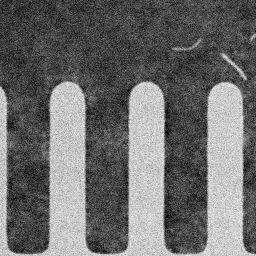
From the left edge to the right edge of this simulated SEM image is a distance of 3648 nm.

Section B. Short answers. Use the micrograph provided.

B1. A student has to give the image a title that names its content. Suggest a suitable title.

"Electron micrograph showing groups of lines, slits or small figures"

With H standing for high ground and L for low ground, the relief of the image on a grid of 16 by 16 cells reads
LLLLLLLLLLLLLLLL
LLLLLLLLLLLLLLLL
LLLLLLLLLLLLLLLL
LLLLLLLLLLLLLLLL
LLLLLLLLLLLLLLLL
LLLLHLLLLHLLLHHL
LLLHHLLLHHLLLHHL
LLLHHLLLHHLLLHHL
LLLHHLLLHHLLLHHL
LLLHHLLLHHLLLHHL
LLLHHLLLHHLLLHHL
LLLHHLLLHHLLLHHL
LLLHHLLLHHLLLHHL
LLLHHLLLHHLLLHHL
LLLHHLLLHHLLLHHL
HLLHHHLLHHLLLHHL